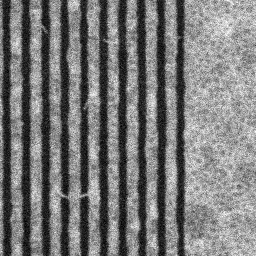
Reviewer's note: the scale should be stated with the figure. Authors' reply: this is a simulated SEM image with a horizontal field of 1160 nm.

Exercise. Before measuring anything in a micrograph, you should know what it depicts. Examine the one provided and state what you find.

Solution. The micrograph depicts parallel lines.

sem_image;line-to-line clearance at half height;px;9.36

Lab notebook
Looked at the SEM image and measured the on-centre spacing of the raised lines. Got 87.4 nanometers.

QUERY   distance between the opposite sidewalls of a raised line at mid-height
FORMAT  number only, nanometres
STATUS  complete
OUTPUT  43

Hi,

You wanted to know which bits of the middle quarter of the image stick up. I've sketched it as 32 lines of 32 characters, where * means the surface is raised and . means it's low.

.***..***..**...**...**...**..**
..**..***..**...**...**...**..**
..**..***..**...**...**...**..**
..**..***..**...**...**...**..**
..**..***..**...**...**...**...*
..**..***..***..**...**...**...*
..**..***..**...**...**...**...*
..**..***..**...**...**...**...*
..**..***..**...**...**...**..**
..**..***..**...**...**...**..**
..**..***..**...**...**...**..**
..**..***..**...**...**...**..**
.***..***..**...**...**...**..**
.***..***..**...**...**...**..**
.***..***..**...***..**...**...*
.***..***..**...**...**...**...*
.***..***..**...**...**...**..**
.***..***..**...**...**...**..**
..**..***..**...**...**...**..**
..**..***..**...**...**...**...*
..**..***..**...**...**...**..**
.***..***..**...**..***...**...*
.***..**...**...**...**...**..**
.***..**...**...**...**...**...*
..**..**...**...**...**..***...*
..**..***..**...**...**..***...*
..**..***..**...**...**..***...*
..**..***..**...**...**..***...*
..**..**...**...**...**...**...*
..**..**...**...**...**..***..**
..**..***..**...**...**..***..**
..**..***..***..**...**...**...*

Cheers